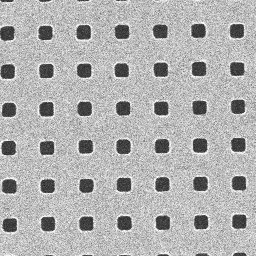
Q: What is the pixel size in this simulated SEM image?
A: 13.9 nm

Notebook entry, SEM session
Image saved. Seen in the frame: a regular array of holes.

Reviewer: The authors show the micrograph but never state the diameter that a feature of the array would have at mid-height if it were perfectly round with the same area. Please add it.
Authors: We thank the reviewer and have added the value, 0.22 µm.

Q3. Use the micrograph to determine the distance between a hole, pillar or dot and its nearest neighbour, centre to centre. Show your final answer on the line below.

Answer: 37.9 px